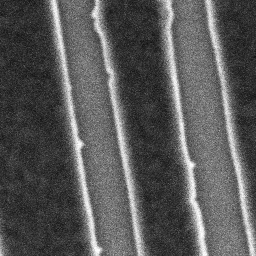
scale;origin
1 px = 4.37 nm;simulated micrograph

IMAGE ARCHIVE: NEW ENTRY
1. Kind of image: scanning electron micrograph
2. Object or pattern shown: one or a few lines or trenches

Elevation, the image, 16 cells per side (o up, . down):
oooo..ooooo..ooo
oooo..ooooo..ooo
oooo..ooooo..ooo
oooo...oooo...oo
oooo...oooo...oo
oooo...oooo...oo
oooo...oooo...oo
ooooo..oooo...oo
ooooo..oooo...oo
ooooo...oooo...o
ooooo...oooo...o
ooooo...oooo...o
oooooo..oooo...o
oooooo..ooooo..o
oooooo..ooooo..o
oooooo...oooo...